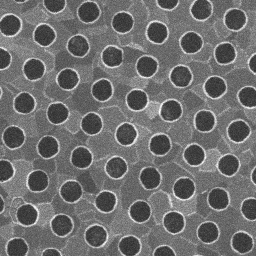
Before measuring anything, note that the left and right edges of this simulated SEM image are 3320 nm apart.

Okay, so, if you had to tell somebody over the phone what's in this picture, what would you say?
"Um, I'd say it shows a regular array of holes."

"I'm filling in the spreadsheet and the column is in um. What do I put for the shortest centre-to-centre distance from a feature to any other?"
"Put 0.456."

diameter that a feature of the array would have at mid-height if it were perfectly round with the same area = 285 nanometers